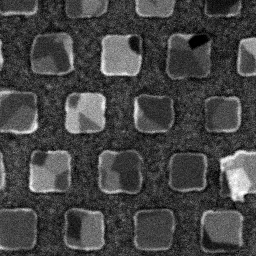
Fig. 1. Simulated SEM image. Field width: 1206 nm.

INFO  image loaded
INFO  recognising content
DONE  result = a regular array of raised bodies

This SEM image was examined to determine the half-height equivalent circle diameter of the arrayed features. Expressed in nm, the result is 205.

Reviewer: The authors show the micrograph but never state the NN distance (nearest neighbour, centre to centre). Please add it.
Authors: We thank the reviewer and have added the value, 316 nm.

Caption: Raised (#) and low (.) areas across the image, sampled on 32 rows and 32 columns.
#####...#####....#####....####..
####....#####....####.....####..
................................
................................
.....####.....#.#.....####......
....#####....#####...#####....##
....#####....#####...#####....##
....#####....#####...#####....##
....#####....####....#####....##
.....................#####......
................................
###.............................
####....#####....####.....####..
#####...#####....#####....####..
#####...#####....#####....####..
#####...#####....#####....####..
.###.....##.......##............
................................
................................
....#####...#####.....###....###
....#####...######...#####..####
....#####...######...#####..####
....#####...######...#####..####
....#####....#####....###...####
.............................#..
................................
####....####.....####.....####..
#####...#####....#####...#####..
#####...#####....#####...#####..
#####...#####....#####...#####..
####....#####....####....#####..
................................